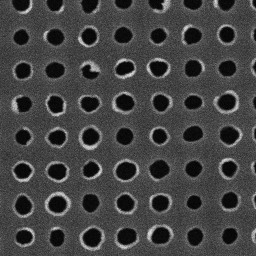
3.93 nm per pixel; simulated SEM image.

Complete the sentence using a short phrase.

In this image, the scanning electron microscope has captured a regular array of holes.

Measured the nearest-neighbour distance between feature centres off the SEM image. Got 0.13 um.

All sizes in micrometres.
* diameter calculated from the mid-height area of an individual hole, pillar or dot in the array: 0.0635